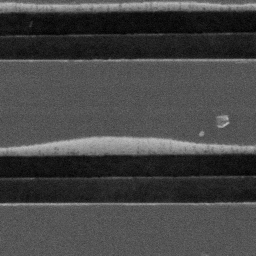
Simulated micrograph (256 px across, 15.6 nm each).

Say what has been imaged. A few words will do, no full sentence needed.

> lines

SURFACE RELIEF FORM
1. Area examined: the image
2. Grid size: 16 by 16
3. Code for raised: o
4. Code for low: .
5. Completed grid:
oooooooo........
................
................
................
oooooooooooooooo
oooooooooooooooo
oooooooooooooooo
oooooooooooooooo
oooooooooooooooo
o...............
................
................
................
oooooooooooooooo
oooooooooooooooo
oooooooooooooooo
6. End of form